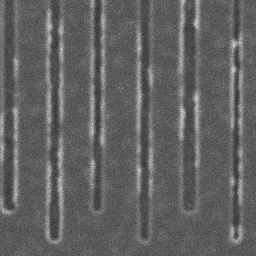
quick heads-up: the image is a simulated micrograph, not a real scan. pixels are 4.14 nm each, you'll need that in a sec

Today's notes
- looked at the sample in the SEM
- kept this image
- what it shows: parallel lines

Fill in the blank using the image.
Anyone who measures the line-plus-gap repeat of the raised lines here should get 189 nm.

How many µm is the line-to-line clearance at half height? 0.0389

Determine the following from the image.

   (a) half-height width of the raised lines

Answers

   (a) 149 nm